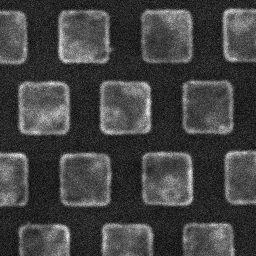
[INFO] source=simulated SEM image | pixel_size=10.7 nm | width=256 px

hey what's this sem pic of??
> raised bodies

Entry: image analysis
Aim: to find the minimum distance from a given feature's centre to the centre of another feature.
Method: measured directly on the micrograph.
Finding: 874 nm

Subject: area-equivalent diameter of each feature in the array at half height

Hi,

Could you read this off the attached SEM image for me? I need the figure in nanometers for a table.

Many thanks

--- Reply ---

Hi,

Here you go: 598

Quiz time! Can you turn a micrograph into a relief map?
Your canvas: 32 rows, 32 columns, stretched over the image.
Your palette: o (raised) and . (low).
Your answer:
................................
........ooooo.....ooooo.....oooo
ooo....ooooooo....oooooo....oooo
ooo....ooooooo....oooooo....oooo
ooo.....oooooo....oooooo....oooo
ooo.....oooooo....oooooo....oooo
ooo.....oooooo....oooooo....oooo
ooo.....ooooo.....oooooo.....ooo
................................
................................
...ooooo.....ooooo.....oooooo...
..oooooo.....oooooo....oooooo...
...ooooo.....oooooo....oooooo...
...oooooo....oooooo....oooooo...
...oooooo....oooooo....oooooo...
...oooooo....oooooo....oooooo...
...ooooo.....ooooo......ooooo...
................................
................................
ooo.....ooooo.....oooooo....oooo
ooo.....oooooo....oooooo....oooo
ooo.....oooooo....oooooo....oooo
ooo.....oooooo....oooooo....oooo
ooo.....oooooo....oooooo....oooo
ooo.....oooooo....oooooo....oooo
ooo.....ooooo...................
................................
................................
...ooooo.....oooooo....oooooo...
...oooooo....oooooo....oooooo...
...oooooo....oooooo....oooooo...
...oooooo....oooooo....oooooo...